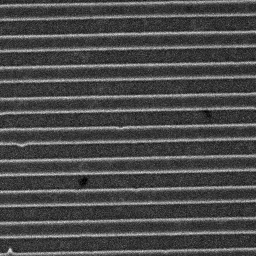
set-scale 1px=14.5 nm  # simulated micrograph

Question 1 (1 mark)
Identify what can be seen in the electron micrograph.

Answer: parallel lines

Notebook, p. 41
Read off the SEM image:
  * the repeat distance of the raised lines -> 451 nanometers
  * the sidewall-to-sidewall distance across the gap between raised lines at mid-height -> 223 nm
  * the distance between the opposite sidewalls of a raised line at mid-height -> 0.223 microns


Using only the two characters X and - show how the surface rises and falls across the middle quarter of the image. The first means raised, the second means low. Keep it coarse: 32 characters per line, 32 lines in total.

-------XXXXXXXXXXXXXXXXXXXXXXXXX
XXXXXXXXXXXXXXXXXXXXXXXXXXXXXXXX
XXXXXXXXXXXXXXXXXXXXXXXXXXXXXXXX
XXXXXXXXXXXXXXXXXXXXXXXXXXXXXXXX
--------------------------------
--------------------------------
--------------------------------
--------------------------------
XXXXXXXXXXXXXXXXXXXXXXXXXXXXXXXX
XXXXXXXXXXXXXXXXXXXXXXXXXXXXXXXX
XXXXXXXXXXXXXXXXXXXXXXXXXXXXXXXX
XXXXXXXXXXXXXXXXXXXXXXXXXXXXXXX-
--------------------------------
--------------------------------
--------------------------------
-----------------------XXXX-----
XXXXXXXXXXXXXXXXXXXXXXXXXXXXXXXX
XXXXXXXXXXXXXXXXXXXXXXXXXXXXXXXX
XXXXXXXXXXXXXXXXXXXXXXXXXXXXXXXX
XXXXXXXXXXXXXX---X--------------
--------------------------------
--------------------------------
--------------------------------
------------------XXXXXXXXXXXXXX
XXXXXXXXXXXXXXXXXXXXXXXXXXXXXXXX
XXXXXXXXXXXXXXXXXXXXXXXXXXXXXXXX
XXXXXXXXXXXXXXXXXXXXXXXXXXXXXXXX
XXXXXX--------------------------
--------------------------------
--------------------------------
--------------------------------
-XX--XXXXXXXXXXXXXXXXXXXXXXXXXXX